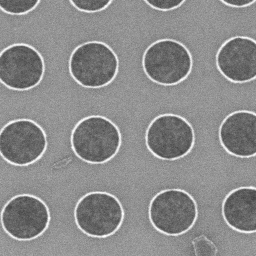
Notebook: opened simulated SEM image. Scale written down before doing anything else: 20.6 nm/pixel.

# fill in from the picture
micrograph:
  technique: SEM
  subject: raised bodies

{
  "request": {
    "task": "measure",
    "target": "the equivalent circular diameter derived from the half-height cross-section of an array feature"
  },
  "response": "0.953 microns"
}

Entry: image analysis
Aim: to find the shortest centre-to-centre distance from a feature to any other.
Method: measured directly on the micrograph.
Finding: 1520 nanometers